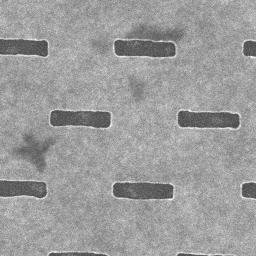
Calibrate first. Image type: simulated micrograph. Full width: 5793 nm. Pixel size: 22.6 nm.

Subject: holes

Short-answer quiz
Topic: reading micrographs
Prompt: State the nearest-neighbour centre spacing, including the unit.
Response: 2.15 micrometres